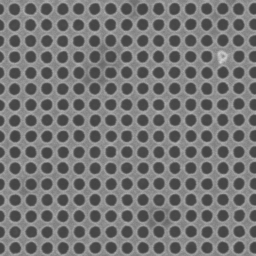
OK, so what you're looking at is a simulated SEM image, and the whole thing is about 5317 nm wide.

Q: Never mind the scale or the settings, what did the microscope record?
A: a regular array of holes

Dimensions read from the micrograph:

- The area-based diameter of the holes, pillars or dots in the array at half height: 248 nm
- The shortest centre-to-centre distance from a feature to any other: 15.7 pixels